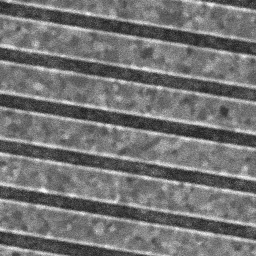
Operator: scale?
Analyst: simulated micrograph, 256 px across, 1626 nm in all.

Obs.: parallel lines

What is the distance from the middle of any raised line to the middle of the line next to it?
0.288 µm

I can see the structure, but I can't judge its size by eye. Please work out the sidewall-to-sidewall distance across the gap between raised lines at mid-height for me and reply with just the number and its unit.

0.102 microns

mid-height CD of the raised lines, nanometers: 187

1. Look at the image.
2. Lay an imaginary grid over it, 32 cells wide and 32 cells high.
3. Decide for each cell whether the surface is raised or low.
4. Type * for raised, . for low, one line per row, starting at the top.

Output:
...***********************......
..........**********************
***............*****************
*********.............**********
***************.............****
**********************..........
.....***********************....
...........*********************
*****............***************
***********............*********
*****************............***
************************........
......************************..
............********************
******.............*************
************.............*******
******************.............*
..***********************.......
........***********************.
**............******************
********............************
**************............******
********************............
...************************.....
.........***********************
****...........*****************
**********............**********
***************.............****
*********************...........
.....***********************....
...........*********************
****.............***************